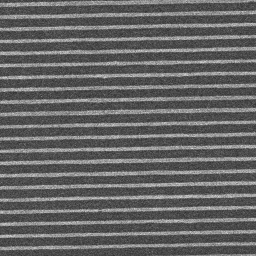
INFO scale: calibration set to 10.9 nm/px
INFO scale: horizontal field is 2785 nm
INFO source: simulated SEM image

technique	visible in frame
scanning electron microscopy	parallel lines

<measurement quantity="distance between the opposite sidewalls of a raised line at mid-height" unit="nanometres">29.9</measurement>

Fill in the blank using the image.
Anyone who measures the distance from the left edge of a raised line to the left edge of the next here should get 0.133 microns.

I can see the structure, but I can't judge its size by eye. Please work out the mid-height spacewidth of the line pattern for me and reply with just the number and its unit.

101 nm